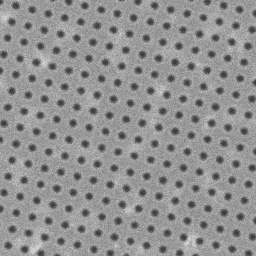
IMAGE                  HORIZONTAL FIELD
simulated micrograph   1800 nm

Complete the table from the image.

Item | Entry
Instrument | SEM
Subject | a regular array of holes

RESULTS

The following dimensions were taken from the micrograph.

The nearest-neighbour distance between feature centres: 116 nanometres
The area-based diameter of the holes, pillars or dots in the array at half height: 0.0583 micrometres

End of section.